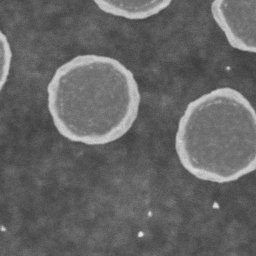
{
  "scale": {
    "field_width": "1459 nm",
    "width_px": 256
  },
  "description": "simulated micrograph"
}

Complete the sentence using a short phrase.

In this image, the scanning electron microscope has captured raised bodies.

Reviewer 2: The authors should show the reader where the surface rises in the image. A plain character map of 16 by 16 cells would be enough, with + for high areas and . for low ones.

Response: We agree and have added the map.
.......+++....++
..............++
...............+
................
....++++........
...+++++........
...+++++....+++.
....++++....++++
....+++....+++++
...........+++++
............+++.
................
................
................
................
................